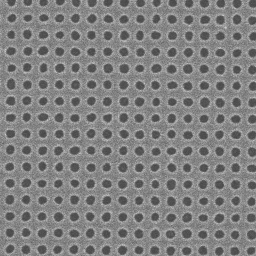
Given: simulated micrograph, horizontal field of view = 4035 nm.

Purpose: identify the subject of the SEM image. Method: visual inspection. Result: a regular array of holes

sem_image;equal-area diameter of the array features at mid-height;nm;143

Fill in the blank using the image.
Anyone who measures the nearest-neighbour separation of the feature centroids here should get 250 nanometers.